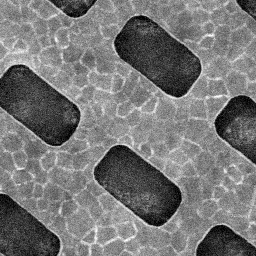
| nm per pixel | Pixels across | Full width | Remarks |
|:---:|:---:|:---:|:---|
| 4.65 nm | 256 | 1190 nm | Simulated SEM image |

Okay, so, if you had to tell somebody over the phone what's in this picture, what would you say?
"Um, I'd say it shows holes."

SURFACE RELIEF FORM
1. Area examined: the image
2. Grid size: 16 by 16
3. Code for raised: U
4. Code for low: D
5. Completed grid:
UUUUDDUUUUUUUUUD
UUUUUUUUDDUUUUUU
UUUUUUUDDDDUUUUU
UUUUUUUDDDDDUUUU
DDUUUUUUUDDDDUUU
DDDUUUUUUUDDUUUU
DDDDDUUUUUUUUUDD
UDDDDUUUUUUUUDDD
UUDDUUUUUUUUUUDD
UUUUUUUDDUUUUUUD
UUUUUUDDDDUUUUUU
UUUUUUDDDDDUUUUU
DUUUUUUDDDDUUUUU
DDUUUUUUUDDUUUUU
DDDUUUUUUUUUUDDU
DDDDUUUUUUUUDDDD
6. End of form